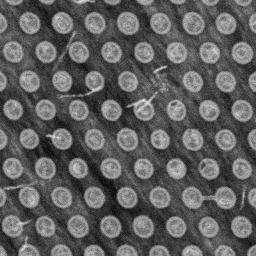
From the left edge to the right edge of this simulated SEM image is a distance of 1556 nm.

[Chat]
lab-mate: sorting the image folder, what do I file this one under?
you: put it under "a regular array of raised bodies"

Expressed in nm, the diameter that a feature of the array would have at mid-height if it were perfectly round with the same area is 116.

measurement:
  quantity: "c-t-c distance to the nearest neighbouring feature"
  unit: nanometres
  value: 198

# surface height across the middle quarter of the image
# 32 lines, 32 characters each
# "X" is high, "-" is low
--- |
--------------------------------
--------------------------------
X-----XXX------XX--------------X
XX----XXXX----XXXX------------XX
XX----XXXX----XXXX------------XX
XX----XXXX----XXXX------------XX
X------XX------XX---------------
--------------------------------
--------------------------------
--XX------XXX------XXX----------
--XXX-----XXXX---XXXXX------XX--
--XXXX----XXXX----XXXX----XXXX--
--XXXX----XXXX----XXXX----XXXX--
---XX-----XXX------XXX-----XXX--
--------------------------------
--------------------------------
---------------XX---------------
X-----XXX-----XXXX----XXXX----XX
XX----XXXX----XXXX----XXXX----XX
XX----XXXX----XXXX----XXXX----XX
XX----XXX-----XXXX-----XXX-----X
--------------------------------
--------------------------------
--------------------------------
--XXX-----XXX-----XXX-----XXX---
-XXXXX---XXXXX----XXXX----XXXX--
-XXXXX----XXXX----XXXX----XXXX--
--XXX-----XXXX----XXXX-----XXX--
--------------------------------
--------------------------------
--------------------------------
X-----XXX-----XXX-----XXX-----XX